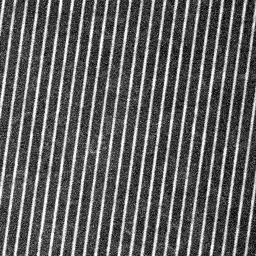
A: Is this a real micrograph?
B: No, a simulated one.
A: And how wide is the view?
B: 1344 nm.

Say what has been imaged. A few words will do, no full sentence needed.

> parallel lines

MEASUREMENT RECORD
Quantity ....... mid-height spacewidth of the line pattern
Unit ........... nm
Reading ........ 50.7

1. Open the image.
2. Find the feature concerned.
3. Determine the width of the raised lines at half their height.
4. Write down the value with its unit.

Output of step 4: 8.4 nm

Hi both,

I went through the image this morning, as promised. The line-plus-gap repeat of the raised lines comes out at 59.9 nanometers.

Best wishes